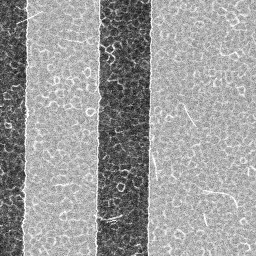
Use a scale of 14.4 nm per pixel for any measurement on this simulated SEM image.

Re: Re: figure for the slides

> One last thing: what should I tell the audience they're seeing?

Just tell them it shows one or a few lines or trenches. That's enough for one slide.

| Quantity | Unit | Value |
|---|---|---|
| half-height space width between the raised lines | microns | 1.03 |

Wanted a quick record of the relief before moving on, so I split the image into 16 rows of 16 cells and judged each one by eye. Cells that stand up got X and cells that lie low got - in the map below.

XX----XXX-------
XX----XXX-------
XX----XXX-------
XX----XXX-------
XX----XXX-------
XX----XXX-------
XX----XXX-------
XX----XXX-------
XX----XXX-------
XX----XXX-------
XX----XXX-------
XX----XXX-------
XX----XXX-------
XX----XXX-------
X-----XXX-------
X-----XXX-------